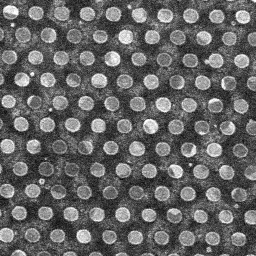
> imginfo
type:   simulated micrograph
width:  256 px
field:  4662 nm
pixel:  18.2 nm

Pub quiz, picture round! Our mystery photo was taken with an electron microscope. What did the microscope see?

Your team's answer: a regular array of raised bodies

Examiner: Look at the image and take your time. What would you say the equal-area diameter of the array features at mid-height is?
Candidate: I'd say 250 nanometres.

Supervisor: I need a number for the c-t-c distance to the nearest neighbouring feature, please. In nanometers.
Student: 462